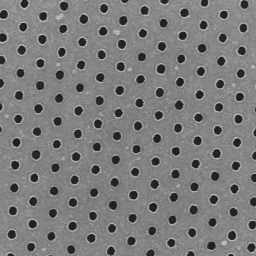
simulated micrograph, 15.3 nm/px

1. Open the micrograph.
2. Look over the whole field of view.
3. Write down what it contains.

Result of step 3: a regular array of holes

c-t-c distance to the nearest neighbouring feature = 347 nm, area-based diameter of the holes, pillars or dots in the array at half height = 8.59 px